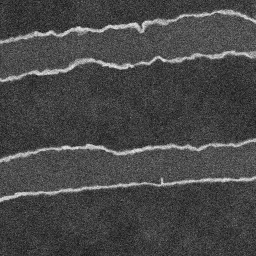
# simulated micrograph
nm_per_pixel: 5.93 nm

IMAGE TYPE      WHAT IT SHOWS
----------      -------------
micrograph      one or a few lines or trenches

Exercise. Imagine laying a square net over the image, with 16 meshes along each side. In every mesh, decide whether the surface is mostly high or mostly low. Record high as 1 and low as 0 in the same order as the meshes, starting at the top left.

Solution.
1111111111111111
1111111110000000
1000000000000000
0000000000001011
0001111111111111
1111111111111111
1111111111111111
1111111111111111
1111111111111111
1100000100000000
0000000000000000
0000000011111111
1111111111111111
1111111111111111
1111111111111111
1111111111111111